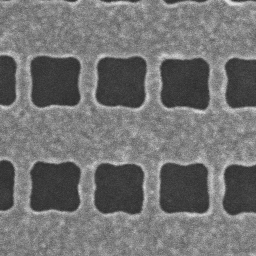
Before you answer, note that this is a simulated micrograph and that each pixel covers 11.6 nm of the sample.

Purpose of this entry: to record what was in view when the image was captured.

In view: holes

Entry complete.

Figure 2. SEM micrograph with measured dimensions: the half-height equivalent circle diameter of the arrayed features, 638 nm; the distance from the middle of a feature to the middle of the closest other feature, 742 nanometres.